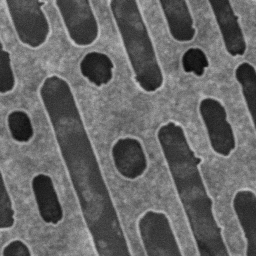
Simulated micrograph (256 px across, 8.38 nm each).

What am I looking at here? parallel lines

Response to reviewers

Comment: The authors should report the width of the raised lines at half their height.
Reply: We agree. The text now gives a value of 176 nm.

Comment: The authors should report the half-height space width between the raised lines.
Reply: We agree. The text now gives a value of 230 nm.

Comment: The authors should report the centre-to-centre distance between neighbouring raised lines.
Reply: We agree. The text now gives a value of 393 nm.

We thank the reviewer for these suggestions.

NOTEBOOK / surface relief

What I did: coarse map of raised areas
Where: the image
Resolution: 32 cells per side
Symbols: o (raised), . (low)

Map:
o....oo....ooo...ooo...ooo...ooo
o....oo.....oo....oo....ooo..ooo
o.....oo....oo....ooo...ooo...oo
oo....oo....ooo...ooo...ooo...oo
oo....ooo...ooo....oo...oooo..oo
ooo..oooo..oooo....ooooooooo...o
.oooooooooo.oooo...oooo..oooo..o
.ooooooooo....oo....ooo...oooooo
.ooooooooo....oo....ooo...oooo..
..oooo.oooo...ooo...ooooooooo...
..ooo....ooo.oooo...oooooooooo..
.oooo....ooooooooooooooooooooo..
ooooo....oooooooooooooooo..oooo.
oooooo....ooooooooooooooo...ooo.
o...oo....ooooooooooooooo...ooo.
o...oo....ooooooooooo.ooo....ooo
o...ooo....ooooooooo...ooo...ooo
oo..ooo....oooo..ooo...ooo...ooo
ooooooo.....oo....oo....ooo..ooo
oooooooo....oo....ooo....ooooooo
oooooooo....oo....ooo....ooooooo
oooooooo.....oo...ooo....ooooooo
oooo..ooo....ooooooooo...ooooooo
.ooo...oo....ooooooooo....oooooo
.ooo...ooo....oooooooo....ooo...
..ooo...oo....ooooooooo....oo...
..ooo...oo.....ooo..ooo....oo...
..ooo...oo.....oo....oo....ooo..
.oooooooooo....oo....ooo....oo..
ooooooooooo.....oo....oo....ooo.
o..ooooooooo....oo....oo....ooo.
....oooooooo....oo.....oo....oo.